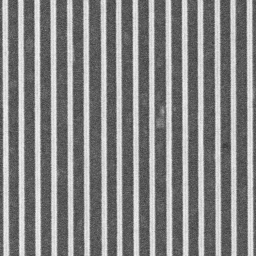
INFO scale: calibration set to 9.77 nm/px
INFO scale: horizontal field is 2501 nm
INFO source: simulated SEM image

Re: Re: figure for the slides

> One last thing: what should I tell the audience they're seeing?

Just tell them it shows parallel lines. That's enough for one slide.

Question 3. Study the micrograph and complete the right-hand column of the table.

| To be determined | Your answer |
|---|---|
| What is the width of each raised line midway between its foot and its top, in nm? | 34.2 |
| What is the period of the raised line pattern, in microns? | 0.159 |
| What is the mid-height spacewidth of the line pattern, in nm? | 118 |